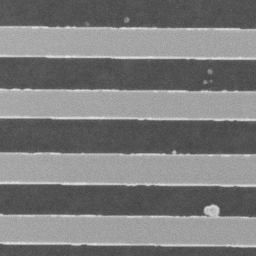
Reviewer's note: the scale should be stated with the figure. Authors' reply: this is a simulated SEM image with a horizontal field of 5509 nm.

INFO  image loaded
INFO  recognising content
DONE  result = lines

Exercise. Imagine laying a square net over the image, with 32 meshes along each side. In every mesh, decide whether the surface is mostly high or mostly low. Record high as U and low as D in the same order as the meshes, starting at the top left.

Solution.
DDDDDDDDDDDDDDDDDDDDDDDDDDDDDDDD
DDDDDDDDDDDDDDDDDDDDDDDDDDDDDDDD
DDDDDDDDDDDDDDDDDDDDDDDDDDDDDDDD
UUUUUUUUUUUUUUUUUUDUDDDDDDDDDDDD
UUUUUUUUUUUUUUUUUUUUUUUUUUUUUUUU
UUUUUUUUUUUUUUUUUUUUUUUUUUUUUUUU
UUUUUUUUUUUUUUUUUUUUUUUUUUUUUUUU
DDDDDDDDDDDDDDDDDDDDDDDDDDDDDDDD
DDDDDDDDDDDDDDDDDDDDDDDDDDDDDDDD
DDDDDDDDDDDDDDDDDDDDDDDDDDDDDDDD
DDDDDDDDDDDDDDDDDDDDDDDDDDDDDDDD
UUUUUUUUUUUUUUUUUUUUUUUUUUUUUUUU
UUUUUUUUUUUUUUUUUUUUUUUUUUUUUUUU
UUUUUUUUUUUUUUUUUUUUUUUUUUUUUUUU
UUUUUUUUUUUUUUUUUUUUUUUUUUUUUUUU
DDDDDDDDDDDDDDDDDDDDDDDDDDDDDDDD
DDDDDDDDDDDDDDDDDDDDDDDDDDDDDDDD
DDDDDDDDDDDDDDDDDDDDDDDDDDDDDDDD
DDDDDDDDDDDDDDDDDDDDDDDDDDDDDDDD
UUUUUUUUUUUUUUUUUUUUUUUUUUUUUUUU
UUUUUUUUUUUUUUUUUUUUUUUUUUUUUUUU
UUUUUUUUUUUUUUUUUUUUUUUUUUUUUUUU
UUUUUUUUUUUUUUUUUUUUUUUUUUUUUUUU
DDDDDDDDDDDDDDDDDDDDDDDDDDDDDDDD
DDDDDDDDDDDDDDDDDDDDDDDDDDDDDDDD
DDDDDDDDDDDDDDDDDDDDDDDDDDDDDDDD
DDDDDDDDDDDDDDDDDDDDDDDDDDUDDDDD
UUUUUUUUUUUUUUUUUUUUUUUUUUUUUUUU
UUUUUUUUUUUUUUUUUUUUUUUUUUUUUUUU
UUUUUUUUUUUUUUUUUUUUUUUUUUUUUUUU
DDDDDDDDDDDUUUUUUUUUUUUUUUUUUUUU
DDDDDDDDDDDDDDDDDDDDDDDDDDDDDDDD